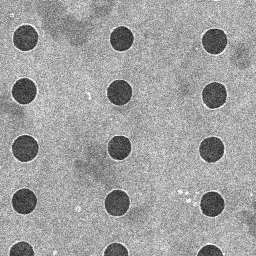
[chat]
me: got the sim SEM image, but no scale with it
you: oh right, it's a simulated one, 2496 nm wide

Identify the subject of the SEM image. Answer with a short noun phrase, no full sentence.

a regular array of holes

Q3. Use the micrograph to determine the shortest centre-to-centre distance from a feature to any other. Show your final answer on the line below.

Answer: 0.525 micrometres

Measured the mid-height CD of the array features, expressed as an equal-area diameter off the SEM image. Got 255 nm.